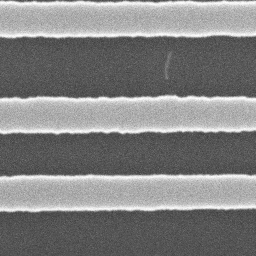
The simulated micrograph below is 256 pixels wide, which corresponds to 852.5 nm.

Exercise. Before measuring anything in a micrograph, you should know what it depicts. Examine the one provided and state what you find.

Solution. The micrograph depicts lines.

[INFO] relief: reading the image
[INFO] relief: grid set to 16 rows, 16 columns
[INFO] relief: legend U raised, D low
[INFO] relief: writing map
UUUUUUUUUUUUUUUU
UUUUUUUUUUUUUUUU
DDDDDDDDDDDDDDDD
DDDDDDDDDDDDDDDD
DDDDDDDDDDDDDDDD
DDDDDDDDDDDDDDDD
UUUUUUUUUUUUUUUU
UUUUUUUUUUUUUUUU
DDDDDDDDDDDDDDDD
DDDDDDDDDDDDDDDD
DDDDDDDDDDDDDDDD
UUUUUUUUUUUUUUUU
UUUUUUUUUUUUUUUU
DDDDDDDDDDDDDDDD
DDDDDDDDDDDDDDDD
DDDDDDDDDDDDDDDD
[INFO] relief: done